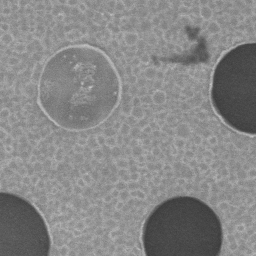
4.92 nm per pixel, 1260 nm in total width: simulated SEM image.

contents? holes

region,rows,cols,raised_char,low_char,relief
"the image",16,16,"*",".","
****************
****************
****************
**************..
*************...
*************...
*************...
**************..
****************
****************
****************
****************
..********..****
...******.....**
...******.....**
...******.....**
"